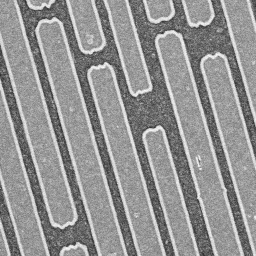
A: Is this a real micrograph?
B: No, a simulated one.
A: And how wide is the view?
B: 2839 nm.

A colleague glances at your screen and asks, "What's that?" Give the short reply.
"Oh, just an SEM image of parallel lines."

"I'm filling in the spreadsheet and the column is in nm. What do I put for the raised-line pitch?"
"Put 413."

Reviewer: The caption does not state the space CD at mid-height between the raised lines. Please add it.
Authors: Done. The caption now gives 141 nanometers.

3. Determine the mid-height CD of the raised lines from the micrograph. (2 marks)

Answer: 0.274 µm